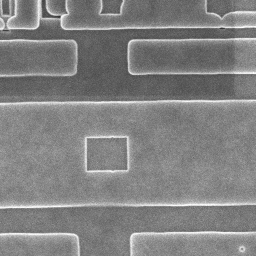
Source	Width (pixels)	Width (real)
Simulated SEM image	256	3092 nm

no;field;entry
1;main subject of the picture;wiring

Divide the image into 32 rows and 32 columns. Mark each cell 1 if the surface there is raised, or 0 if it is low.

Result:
00111000111110011111111111000000
00111000111110011111111111000000
01111000111111111111111111111111
01110000111111110000000000000000
00000000000000000000000000000000
11111111100000001111111111111111
11111111110000001111111111111111
11111111110000001111111111111111
11111111110000001111111111111111
00000000000000000000000000000000
00000000000000000000000000000000
00000000000000000000000000000000
00000000000000000000000000000000
11111111111111111111111111111111
11111111111111111111111111111111
11111111111111111111111111111111
11111111111111111111111111111111
11111111111000001111111111111111
11111111111000001111111111111111
11111111111000001111111111111111
11111111111000001111111111111111
11111111111111111111111111111111
11111111111111111111111111111111
11111111111111111111111111111111
11111111111111111111111111111111
11111111111111111111111111111110
00000000000000000000000000000000
00000000000000000000000000000000
00000000000000000000000000000000
11111111100000000111111111111111
11111111110000001111111111111111
11111111110000001111111111111111